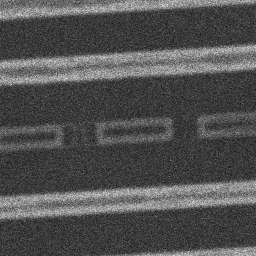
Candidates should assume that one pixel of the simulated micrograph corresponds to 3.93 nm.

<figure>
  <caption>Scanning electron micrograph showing one or a few lines or trenches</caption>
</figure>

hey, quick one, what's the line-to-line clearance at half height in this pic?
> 192 nanometers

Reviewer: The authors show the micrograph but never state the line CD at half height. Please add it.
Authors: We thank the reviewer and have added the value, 63.8 nm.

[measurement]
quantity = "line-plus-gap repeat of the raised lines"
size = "265 nanometers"